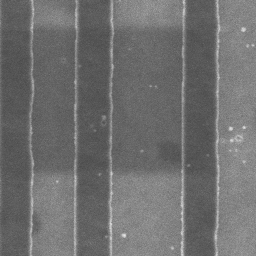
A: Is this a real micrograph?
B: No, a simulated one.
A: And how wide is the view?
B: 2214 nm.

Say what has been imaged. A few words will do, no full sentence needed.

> lines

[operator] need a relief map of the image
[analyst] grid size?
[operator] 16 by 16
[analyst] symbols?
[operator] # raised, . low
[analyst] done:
##...##....###..
##...##....###..
##...##....###..
##...##....###..
##...##....###..
##...##....###..
##...##....###..
##...##....###..
##...##....###..
##...##....###..
##...##....###..
##...##....###..
##...##....###..
##...##....###..
##...##....###..
##...##....###..